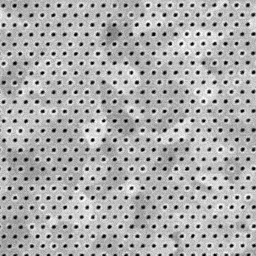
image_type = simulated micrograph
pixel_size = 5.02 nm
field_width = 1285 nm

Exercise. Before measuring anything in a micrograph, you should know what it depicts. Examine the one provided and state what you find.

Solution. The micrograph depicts a regular array of holes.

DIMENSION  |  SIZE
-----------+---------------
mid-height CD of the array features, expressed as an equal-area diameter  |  0.0234 um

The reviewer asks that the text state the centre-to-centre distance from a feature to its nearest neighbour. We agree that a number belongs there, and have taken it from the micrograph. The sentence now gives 53.4 nm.